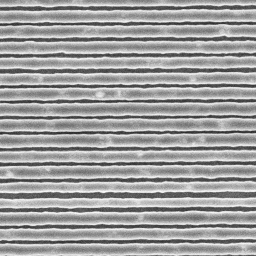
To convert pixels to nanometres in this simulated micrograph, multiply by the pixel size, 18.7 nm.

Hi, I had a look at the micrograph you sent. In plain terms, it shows parallel lines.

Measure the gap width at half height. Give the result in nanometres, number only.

86.4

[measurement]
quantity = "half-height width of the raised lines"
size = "212 nanometers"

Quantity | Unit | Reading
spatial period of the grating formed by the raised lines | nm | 291